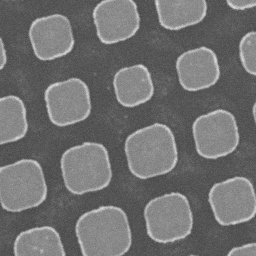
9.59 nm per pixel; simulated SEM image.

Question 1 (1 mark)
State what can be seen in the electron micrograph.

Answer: a regular array of raised bodies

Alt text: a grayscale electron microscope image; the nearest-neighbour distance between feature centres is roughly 67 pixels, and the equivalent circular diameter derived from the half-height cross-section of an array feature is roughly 46.2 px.